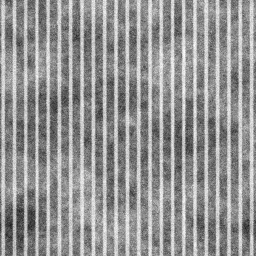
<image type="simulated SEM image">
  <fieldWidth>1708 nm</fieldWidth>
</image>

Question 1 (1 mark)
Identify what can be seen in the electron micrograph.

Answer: parallel lines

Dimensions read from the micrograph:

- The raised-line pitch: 11.3 pixels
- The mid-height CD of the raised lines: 19.2 nm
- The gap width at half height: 56.7 nm